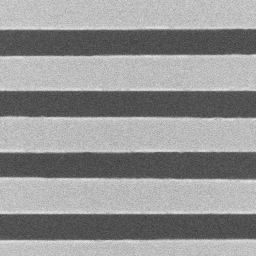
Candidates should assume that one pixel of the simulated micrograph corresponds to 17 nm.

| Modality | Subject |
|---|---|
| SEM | lines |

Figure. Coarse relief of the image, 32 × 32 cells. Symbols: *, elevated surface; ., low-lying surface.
********************************
********************************
********************************
********************************
................................
................................
................................
********************************
********************************
********************************
********************************
................................
................................
................................
................................
********************************
********************************
********************************
********************************
................................
................................
................................
********************************
********************************
********************************
********************************
********************************
................................
................................
................................
********************************
********************************